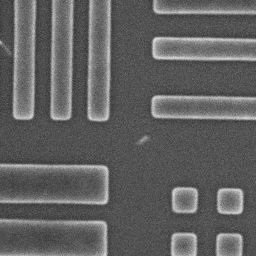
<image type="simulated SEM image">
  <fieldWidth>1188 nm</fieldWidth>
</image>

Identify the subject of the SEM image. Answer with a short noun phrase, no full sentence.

groups of lines, slits or small figures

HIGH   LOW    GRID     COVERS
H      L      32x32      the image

LLHHLLLHHLLHHHLLLLLHHHHHHHHHHHHH
LLHHLLLHHLLHHHLLLLLLHHHHHHHHHHHH
LLHHLLLHHLLHHHLLLLLLLLLLLLLLLLLL
LLHHLLLHHLLHHHLLLLLLLLLLLLLLLLLL
LLHHLLLHHLLHHHLLLLLLLLLLLLLLLLLL
LLHHLLLHHLLHHHLLLLLHHHHHHHHHHHHH
LLHHLLLHHLLHHHLLLLLHHHHHHHHHHHHH
LLHHLLLHHLLHHHLLLLLLLLLLLLLLLLLL
LLHHLLLHHLLHHHLLLLLLLLLLLLLLLLLL
LLHHLLLHHLLHHHLLLLLLLLLLLLLLLLLL
LLHHLLLHHLLHHHLLLLLLLLLLLLLLLLLL
LLHHLLLHHLLHHHLLLLLLLLLLLLLLLLLL
LLHHLLLHHLLHHHLLLLLHHHHHHHHHHHHH
LLHHLLHHHLLHHHLLLLLHHHHHHHHHHHHH
LLHHLLLHHLLHHHLLLLLHHHHHHHHHHHHH
LLLLLLLLLLLLLLLLLLLLLLLLLLLLLLLL
LLLLLLLLLLLLLLLLLLLLLLLLLLLLLLLL
LLLLLLLLLLLLLLLLLLLLLLLLLLLLLLLL
LLLLLLLLLLLLLLLLLLLLLLLLLLLLLLLL
LLLLLLLLLLLLLLLLLLLLLLLLLLLLLLLL
LLLLLLLLLLLLLLLLLLLLLLLLLLLLLLLL
HHHHHHHHHHHHHLLLLLLLLLLLLLLLLLLL
HHHHHHHHHHHHHLLLLLLLLLLLLLLLLLLL
HHHHHHHHHHHHHLLLLLLLLLLLLLLLLLLL
HHHHHHHHHHHHHLLLLLLLLLHHHLLHHHLL
LLLLLLLLLLLLLLLLLLLLLLHHHLLHHHLL
LLLLLLLLLLLLLLLLLLLLLLHHLLLLHHLL
LLLLLLLLLLLLLLLLLLLLLLLLLLLLLLLL
HHHHHHHHHHHHHLLLLLLLLLLLLLLLLLLL
HHHHHHHHHHHHHLLLLLLLLLHHLLLHHHLL
HHHHHHHHHHHHHLLLLLLLLLHHHLLHHHLL
HHHHHHHHHHHHHLLLLLLLLLHHLLLHHHLL